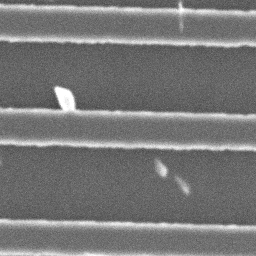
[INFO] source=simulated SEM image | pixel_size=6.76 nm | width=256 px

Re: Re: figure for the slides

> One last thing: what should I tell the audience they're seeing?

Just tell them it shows lines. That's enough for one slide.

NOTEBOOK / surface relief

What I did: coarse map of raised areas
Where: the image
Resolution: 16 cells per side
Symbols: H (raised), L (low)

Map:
HHHHHHHHLLLLLLLL
HHHHHHHHHHHHHHHH
HHHHHHHHHHHHHHHH
LLLLLLLLLLLLLLLL
LLLLLLLLLLLLLLLL
LLLLLLLLLLLLLLLL
LLLLHLLLLLLLLLLL
HHHHHHHHHHHHHHHH
HHHHHHHHHHHHHHHH
LLLLLLLLLLLLLLLL
LLLLLLLLLLLLLLLL
LLLLLLLLLLLLLLLL
LLLLLLLLLLLLLLLL
LLLLLLLLLLLLLLLL
HHHHHHHHHHHHHHHH
HHHHHHHHHHHHHHHH